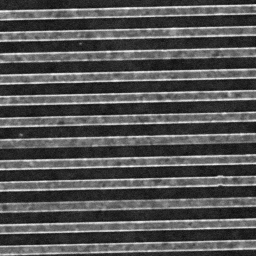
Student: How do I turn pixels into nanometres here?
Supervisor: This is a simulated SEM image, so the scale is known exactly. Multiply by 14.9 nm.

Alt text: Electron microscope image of parallel lines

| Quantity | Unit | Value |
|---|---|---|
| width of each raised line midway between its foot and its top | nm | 133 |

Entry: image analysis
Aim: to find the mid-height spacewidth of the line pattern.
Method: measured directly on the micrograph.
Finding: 190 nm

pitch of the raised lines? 319 nanometers